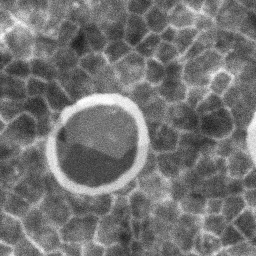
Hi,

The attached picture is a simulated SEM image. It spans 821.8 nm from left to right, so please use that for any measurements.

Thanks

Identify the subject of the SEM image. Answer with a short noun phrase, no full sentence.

raised bodies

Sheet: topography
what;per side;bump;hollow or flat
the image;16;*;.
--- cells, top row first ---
................
................
................
................
................
................
.....***........
....*****.......
...******.......
...******.......
...******.......
....***.........
................
................
................
................